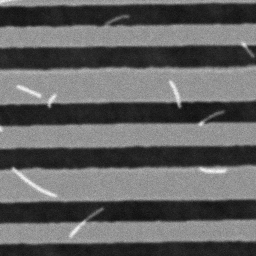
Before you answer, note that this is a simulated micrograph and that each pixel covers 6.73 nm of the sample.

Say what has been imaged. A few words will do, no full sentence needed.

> lines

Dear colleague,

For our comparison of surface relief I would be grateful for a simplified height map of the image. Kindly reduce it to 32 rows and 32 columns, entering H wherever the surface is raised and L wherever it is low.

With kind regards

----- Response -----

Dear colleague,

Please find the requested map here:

HHHHHHHHHHHHHHHHLLLLLLLLLLLLLLLL
LLLLLLLLLLLLLLLLLLLLLLLLLLLLLLLL
LLLLLLLLLLLLLLLLLLLLLLLLLLLLLLLL
HHHHHHHHHHHHHHHHHHHHHHHHHHHHHHHH
HHHHHHHHHHHHHHHHHHHHHHHHHHHHHHHH
HHHHHHHHHHHHHHHHHHHHHHHHHHHHHHHH
LLLLLLLLLLLLLLLLLLLLLLLLLLLLLLLL
LLLLLLLLLLLLLLLLLLLLLLLLLLLLLLLL
LLLLLLLLLLLLLLLLLLLLLLLLLLLLLLHH
HHHHHHHHHHHHHHHHHHHHHHHHHHHHHHHH
HHHHHHHHHHHHHHHHHHHHHHHHHHHHHHHH
HHHHHHHHHHHHHHHHHHHHHHHHHHHHHHHH
HHHHHHHHHHHHHHHHHHHHHHHHHHHHHHHH
LLLLLLLLLLLLLLLLLLLLLLLLLLLLLLLL
LLLLLLLLLLLLLLLLLLLLLLLLLLLLLLLL
LLLLLLLLLLLLLLLLLLLLLLLLHHHHHHHH
HHHHHHHHHHHHHHHHHHHHHHHHHHHHHHHH
HHHHHHHHHHHHHHHHHHHHHHHHHHHHHHHH
HHLLLLLLLLLLLLLLLLLLLLLLLLLLLLLL
LLLLLLLLLLLLLLLLLLLLLLLLLLLLLLLL
LLLLLLLLLLLLLLLLLLLLLLLLLLLLLLLL
HHHHHHHHHHHHHHHHHHHHHHHHHHHHHHHH
HHHHHHHHHHHHHHHHHHHHHHHHHHHHHHHH
HHHHHHHHHHHHHHHHHHHHHHHHHHHHHHHH
HHHHHHHHHHHHHHHHHHHHHHHHHHHHHHHH
LLLLLLLLLLLLLLLLLLLLLLLLLLLLLLLL
LLLLLLLLLLLLLLLLLLLLLLLLLLLLLLLL
LLLLLLLLLLLLLLLLLLLLLLLLLLLLLLLL
HHHHHHHHHHHHHHHHHHHHHHHHHHHHHHHH
HHHHHHHHHHHHHHHHHHHHHHHHHHHHHHHH
LLLLLLLLLLLLLLLLLLLLLLLLLLLLLLLL
LLLLLLLLLLLLLLLLLLLLLLLLLLLLLLLL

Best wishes